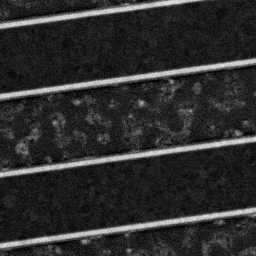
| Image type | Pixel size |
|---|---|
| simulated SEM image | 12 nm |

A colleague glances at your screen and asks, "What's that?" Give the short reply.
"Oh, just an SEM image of one or a few lines or trenches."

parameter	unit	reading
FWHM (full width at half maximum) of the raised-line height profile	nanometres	840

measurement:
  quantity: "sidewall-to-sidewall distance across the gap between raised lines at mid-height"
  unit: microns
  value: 0.933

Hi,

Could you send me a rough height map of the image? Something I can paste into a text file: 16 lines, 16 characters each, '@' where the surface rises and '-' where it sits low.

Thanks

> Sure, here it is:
--------@@@@@@@@
-@@@@@@@@@@@@@@@
@@@@@@@@@@@@@@@@
@@@@@@@@@@@@@@@@
@@@@@@@@@@@-----
@@@@------------
----------------
----------------
----------------
----------@@@@@@
---@@@@@@@@@@@@@
@@@@@@@@@@@@@@@@
@@@@@@@@@@@@@@@@
@@@@@@@@@@@@@---
@@@@@@----------
----------------